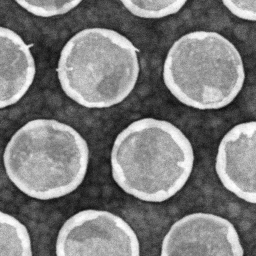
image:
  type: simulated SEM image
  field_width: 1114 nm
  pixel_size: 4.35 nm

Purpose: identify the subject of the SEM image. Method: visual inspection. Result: raised bodies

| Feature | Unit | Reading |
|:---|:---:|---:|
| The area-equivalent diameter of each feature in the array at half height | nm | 339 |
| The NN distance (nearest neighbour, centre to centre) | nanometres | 453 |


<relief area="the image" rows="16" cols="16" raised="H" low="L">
LLHHLLLLHHHLLLHH
LLLLLLLLLLLLLLLL
HLLLLHHHLLLHHHLL
HHLLHHHHLLLHHHHL
HHLLHHHHLLHHHHHL
HHLLHHHHLLLHHHHL
HLLLLHHLLLLLHHLL
LLLLLLLLLLLLLLLL
LHHHHLLLHHHLLLHH
HHHHHLLHHHHHLLHH
LHHHHLLHHHHHLLHH
LHHHHLLLHHHLLLHH
LLLLLLLLLLLLLLLL
LLLLLHHLLLLLHLLL
HLLLHHHHLLLHHHHL
HHLLHHHHHLHHHHHL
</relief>